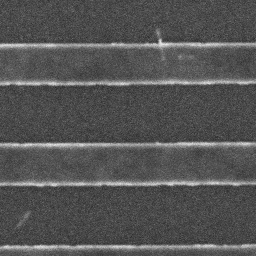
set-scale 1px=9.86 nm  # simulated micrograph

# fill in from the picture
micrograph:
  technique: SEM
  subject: lines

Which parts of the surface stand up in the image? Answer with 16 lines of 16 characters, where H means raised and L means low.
LLLLLLLLLLLLLLLL
LLLLLLLLLLLLLLLL
LLLLLLLLLLLLLLLL
HHHHHHHHHHHHHHHH
HHHHHHHHHHHHHHHH
LLLLLLLLLLLLLLLL
LLLLLLLLLLLLLLLL
LLLLLLLLLLLLLLLL
LLLLLLLLLLLLLLLL
HHHHHHHHHHHHHHHH
HHHHHHHHHHHHHHHH
HHHHHHHHHHHHHLHL
LLLLLLLLLLLLLLLL
LLLLLLLLLLLLLLLL
LLLLLLLLLLLLLLLL
HHHHHHHHHHHHHHHH